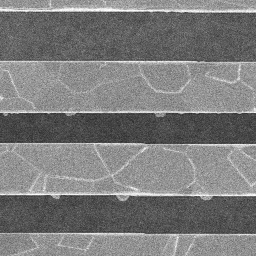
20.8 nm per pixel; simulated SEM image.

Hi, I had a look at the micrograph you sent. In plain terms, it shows lines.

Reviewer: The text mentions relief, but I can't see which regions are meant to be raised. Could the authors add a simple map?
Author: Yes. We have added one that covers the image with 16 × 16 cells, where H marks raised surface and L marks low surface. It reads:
HHHHHHHHHHHHHHHH
LLLLLLLLLLLLLLLL
LLLLLLLLLLLLLLLL
LLLLLLLLLLLLLLLL
HHHHHHHHHHHHHHHH
HHHHHHHHHHHHHHHH
HHHHHHHHHHHHHHHH
LLLLLLLLLLLLLLLL
LLLLLLLLLLLLLLLL
HHHHHHHHHHHHHHHH
HHHHHHHHHHHHHHHH
HHHHHHHHHHHHHHHH
LLLLLLLLLLLLLLLL
LLLLLLLLLLLLLLLL
LLLLLLLLLLLLLLLL
HHHHHHHHHHHHHHHH